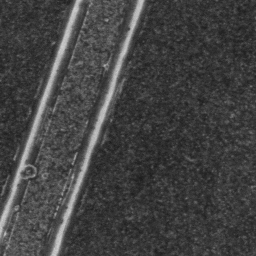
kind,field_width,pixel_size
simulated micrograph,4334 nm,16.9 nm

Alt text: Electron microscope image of one or a few lines or trenches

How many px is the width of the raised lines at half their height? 59.6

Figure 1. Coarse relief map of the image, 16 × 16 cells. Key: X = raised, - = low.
-----XXXX-------
----XXXX--------
----XXXX--------
----XXXX--------
---XXXX---------
---XXXX---------
---XXXX---------
--XXXX----------
--XXXX----------
--XXXX----------
-XXXX-----------
-XXXX-----------
-XXXX-----------
XXXX------------
XXXX------------
XXXX------------